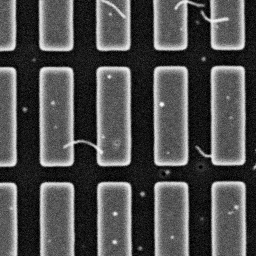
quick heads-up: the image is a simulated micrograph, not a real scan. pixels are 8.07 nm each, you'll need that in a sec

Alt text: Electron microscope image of groups of lines, slits or small figures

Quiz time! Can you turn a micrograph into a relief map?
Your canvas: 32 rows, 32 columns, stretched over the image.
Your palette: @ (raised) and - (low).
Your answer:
@@---@@@@---@@@@---@@@@---@@@@--
@@---@@@@---@@@@---@@@@---@@@@--
@@---@@@@---@@@@---@@@@---@@@@--
@@---@@@@---@@@@---@@@@---@@@@@-
@@---@@@@---@@@@---@@@@---@@@@@-
@@---@@@@---@@@@---@@@@---@@@@@-
--------------------------------
--------------------------------
@-----@@@----@@@----@@@----@@@--
@@---@@@@---@@@@---@@@@---@@@@@-
@@---@@@@---@@@@---@@@@---@@@@@-
@@---@@@@---@@@@---@@@@---@@@@@-
@@---@@@@---@@@@---@@@@---@@@@@-
@@---@@@@---@@@@---@@@@---@@@@@-
@@---@@@@---@@@@---@@@@----@@@@-
@@---@@@@---@@@@---@@@@----@@@@-
@@---@@@@---@@@@---@@@@----@@@@-
@@---@@@@---@@@@---@@@@----@@@@-
@@---@@@@---@@@@---@@@@----@@@@-
@@---@@@@---@@@@---@@@@----@@@@-
@@---@@@@----@@@----@@@----@@@--
--------------------------------
--------------------------------
@@---@@@@---@@@@---@@@@----@@@@-
@@---@@@@---@@@@---@@@@----@@@@-
@@---@@@@---@@@@---@@@@----@@@@-
@@---@@@@---@@@@---@@@@----@@@@-
@@---@@@@---@@@@---@@@@----@@@@-
@@---@@@@---@@@@---@@@@----@@@@-
@@---@@@@---@@@@---@@@@----@@@@-
@@---@@@@---@@@@---@@@@----@@@@-
@@---@@@@---@@@@---@@@@----@@@@-